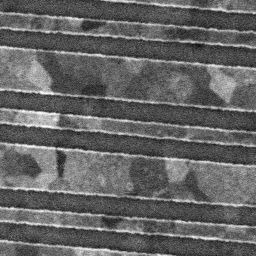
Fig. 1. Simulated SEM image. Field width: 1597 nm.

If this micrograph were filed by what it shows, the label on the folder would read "lines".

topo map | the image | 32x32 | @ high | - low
-------------------@@@@@@@@@@@@@
------------------------------@@
@@@@@@@@@@@@--------------------
@@@@@@@@@@@@@@@@@@@@@@@@@-------
--------------@@@@@@@@@@@@@@@@@@
--------------------------@@@@@@
@@@@@@@-------------------------
@@@@@@@@@@@@@@@@@@@@------------
@@@@@@@@@@@@@@@@@@@@@@@@@@@@@@@-
@@@@@@@@@@@@@@@@@@@@@@@@@@@@@@@@
@@@@@@@@@@@@@@@@@@@@@@@@@@@@@@@@
----@@@@@@@@@@@@@@@@@@@@@@@@@@@@
---------------@@@@@@@@@@@@@@@@@
--------------------------@@@@@@
@@@@@@@@@@----------------------
--@@@@@@@@@@@@@@@@@@@-----------
-------------@@@@@@@@@@@@@@@@@@-
-----------------------@@@@@@@@@
@@@@@@@-------------------------
@@@@@@@@@@@@@@@@@@--------------
@@@@@@@@@@@@@@@@@@@@@@@@@@@@----
@@@@@@@@@@@@@@@@@@@@@@@@@@@@@@@@
@@@@@@@@@@@@@@@@@@@@@@@@@@@@@@@@
-@@@@@@@@@@@@@@@@@@@@@@@@@@@@@@@
--------------@@@@@@@@@@@@@@@@@@
----------------------------@@@@
@@@@@@@-------------------------
@@@@@@@@@@@@@@@@@@@@------------
----------@@@@@@@@@@@@@@@@@@@@@@
----------------------@@@@@@@@@@
@@@@----------------------------
@@@@@@@@@@@@@@@-----------------